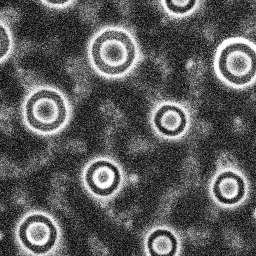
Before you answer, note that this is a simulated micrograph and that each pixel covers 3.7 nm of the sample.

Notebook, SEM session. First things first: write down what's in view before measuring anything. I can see ring-shaped grooves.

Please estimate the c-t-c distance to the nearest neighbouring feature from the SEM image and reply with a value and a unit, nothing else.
88.4 px